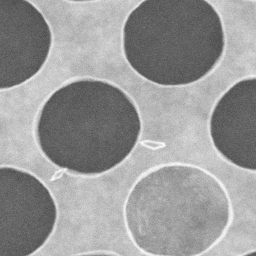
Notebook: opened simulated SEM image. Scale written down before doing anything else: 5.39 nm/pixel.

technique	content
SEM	holes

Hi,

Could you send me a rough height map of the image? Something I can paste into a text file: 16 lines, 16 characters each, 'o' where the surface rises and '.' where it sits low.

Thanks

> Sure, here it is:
..ooooooo....ooo
...ooooo......oo
...ooooo......oo
...ooooo......oo
..ooooooo....ooo
oooo...ooooooo..
ooo.....oooooo..
oo.......oooo...
oo.......oooo...
ooo.....oooooo..
.ooo...ooo..ooo.
...oooooo.....oo
...ooooo......oo
...ooooo......oo
...ooooo......oo
..ooooooo....ooo